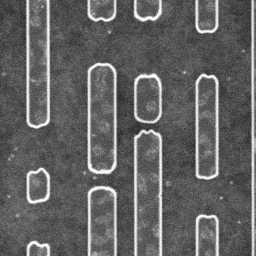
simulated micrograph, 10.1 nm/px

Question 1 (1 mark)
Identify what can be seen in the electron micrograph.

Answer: parallel lines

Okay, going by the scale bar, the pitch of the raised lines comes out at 557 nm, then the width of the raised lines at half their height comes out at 228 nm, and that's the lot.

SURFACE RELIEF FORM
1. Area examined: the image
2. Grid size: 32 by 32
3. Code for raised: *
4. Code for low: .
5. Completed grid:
...***.....***...***.....**.....
...***.....***...***.....**.....
...***...................**.....
...***...................**.....
...***..........................
...***..........................
...***..........................
...***..........................
...***.....***..................
...***.....***...........*......
...***.....***...***.....**.....
...***.....***...***.....**.....
...***.....***...***.....**.....
...***.....***...***.....**.....
...***.....***...***.....**.....
....**.....***...........**.....
...........***....*......**.....
...........***...***.....**.....
...........***...***.....**.....
...........***...***.....**.....
...........***...***.....**.....
....**...........***.....**.....
....**...........***............
....**......*....***............
....**.....***...***............
...........***...***............
...........***...***............
...........***...***.....**.....
...........***...***.....**.....
...........***...***.....**.....
....*......***...***.....**.....
....**.....***...***.....**.....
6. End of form